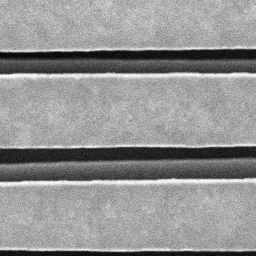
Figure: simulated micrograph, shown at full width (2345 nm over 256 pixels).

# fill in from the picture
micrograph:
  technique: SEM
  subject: lines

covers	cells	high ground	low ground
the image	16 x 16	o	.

oooooooooooooooo
oooooooooooooooo
oooooooooooooooo
................
................
oooooooooooooooo
oooooooooooooooo
oooooooooooooooo
oooooooooooooooo
................
................
oooooooooooooooo
oooooooooooooooo
oooooooooooooooo
oooooooooooooooo
oooooooooooooooo